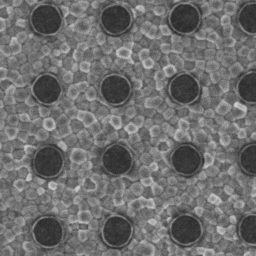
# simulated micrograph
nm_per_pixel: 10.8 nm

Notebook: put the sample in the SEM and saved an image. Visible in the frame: a regular array of raised bodies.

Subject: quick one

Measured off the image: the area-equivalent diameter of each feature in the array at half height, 332 nm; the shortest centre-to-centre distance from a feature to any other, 740 nm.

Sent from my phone